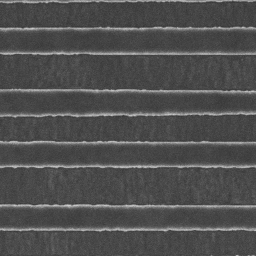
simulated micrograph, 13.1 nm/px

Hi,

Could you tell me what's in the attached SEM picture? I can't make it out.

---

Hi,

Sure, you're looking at lines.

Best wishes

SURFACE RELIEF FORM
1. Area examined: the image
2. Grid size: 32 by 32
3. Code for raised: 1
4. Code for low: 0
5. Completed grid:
00000000000000000000000000000000
00000000000000000000000000000000
00000000000000000000000000000000
00000000000011000001110100110111
11111111111111111111111111111111
11111111111111111111111111111111
11111111111111111111111111111111
00000000000000000000000000000000
00000000000000000000000000000000
00000000000000000000000000000000
00000000000000000000000000000000
11111111111111111111111111111111
11111111111111111111111111111111
11111111111111111111111111111111
01101000000000000000000000000000
00000000000000000000000000000000
00000000000000000000000000000000
00000000000000000000000000000000
11111111111111111111111111111111
11111111111111111111111111111111
11111111111111111111111111111111
00000000000000000000000000000000
00000000000000000000000000000000
00000000000000000000000000000000
00000000000000000000000000000000
00000000000000000000000000000000
11111111111111111111111111111111
11111111111111111111111111111111
11111111111111111111111111111111
00000000000000000000000000000000
00000000000000000000000000000000
00000000000000000000000000000000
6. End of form